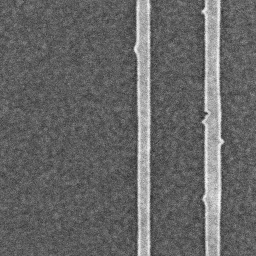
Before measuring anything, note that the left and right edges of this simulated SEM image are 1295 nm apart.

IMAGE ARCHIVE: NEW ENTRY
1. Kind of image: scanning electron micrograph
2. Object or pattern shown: one or a few lines or trenches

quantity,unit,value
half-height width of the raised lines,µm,0.0601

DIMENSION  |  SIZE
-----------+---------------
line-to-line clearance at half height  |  56.7 px